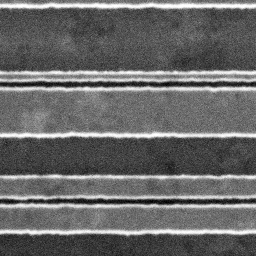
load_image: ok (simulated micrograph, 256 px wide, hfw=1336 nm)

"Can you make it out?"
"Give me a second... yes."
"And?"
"lines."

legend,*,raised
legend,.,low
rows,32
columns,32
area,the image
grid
********************************
................................
................................
................................
................................
................................
................................
................................
................................
********************************
********************************
********************************
********************************
********************************
********************************
********************************
********************************
................................
................................
................................
................................
................................
********************************
********************************
********************************
********************************
********************************
********************************
********************************
................................
................................
................................